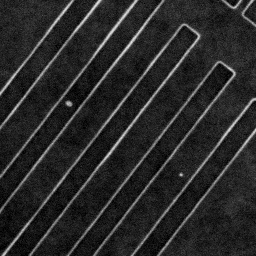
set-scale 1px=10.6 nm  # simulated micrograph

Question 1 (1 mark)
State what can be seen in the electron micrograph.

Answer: groups of lines, slits or small figures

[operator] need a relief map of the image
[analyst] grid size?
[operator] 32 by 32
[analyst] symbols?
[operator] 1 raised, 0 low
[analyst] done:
11111111100011111000111111111010
11111111000111110001111111111110
11111110000111100011111111111110
11111100001111000011111011111111
11111100011111000111110001111111
11111000111110001111100011111111
11110001111100011111000111111111
11100001111000011110000111111111
11100011111000111110001111100111
11000111110001111100011111000111
10001111100011111000111110001111
00011111000111110000111100001111
00011111000111110001111100011111
00111110001111100011111000111110
01111100011111000111110001111100
11111000111110001111100011111000
11110000111100001111100011110000
11110001111100011111000111110001
11100011111000111110001111100011
11000111110001111100011111000111
10001111100001111000011110000111
10001111100011111000111110001111
00011111000111110001111100011111
00111110001111100011111000111111
01111100011111000111110000111111
01111000011111000111110001111111
11111000111110001111100011111111
11110001111100011111000111111111
11100011111000111110001111111111
11000011110000111100001111111111
11000111110001111100011111111111
10001111100011111000111111111111